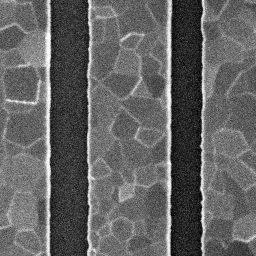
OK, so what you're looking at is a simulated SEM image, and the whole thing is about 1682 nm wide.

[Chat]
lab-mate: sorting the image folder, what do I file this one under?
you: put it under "lines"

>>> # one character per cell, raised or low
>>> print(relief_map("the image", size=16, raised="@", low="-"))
@@@---@@@@@--@@@
@@@---@@@@@--@@@
@@@---@@@@@--@@@
@@@---@@@@@--@@@
@@@--@@@@@@--@@@
@@@--@@@@@@--@@@
@@@--@@@@@@--@@@
@@@---@@@@@--@@@
@@@--@@@@@@--@@@
@@@--@@@@@@--@@@
@@@---@@@@@--@@@
@@@---@@@@@--@@@
@@@---@@@@@--@@@
@@@---@@@@@--@@@
@@@--@@@@@@--@@@
@@@---@@@@@--@@@